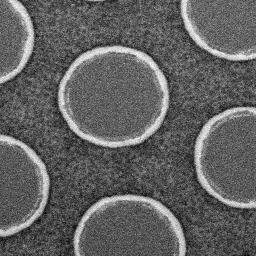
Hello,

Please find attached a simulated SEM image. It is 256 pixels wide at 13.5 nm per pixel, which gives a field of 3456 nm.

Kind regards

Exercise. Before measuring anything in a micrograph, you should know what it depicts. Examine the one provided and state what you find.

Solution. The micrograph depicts raised bodies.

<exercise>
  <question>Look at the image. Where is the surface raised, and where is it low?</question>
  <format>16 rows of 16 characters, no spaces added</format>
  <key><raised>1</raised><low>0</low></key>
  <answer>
1000000000011111
1100000000001111
1100000000001111
1100011110000011
1000111111000000
0000111111000000
0000111111000000
0000111111000111
0000011110000111
1100000000001111
1110000000001111
1110000000000111
1110000110000011
1100011111100000
1000011111100000
0000011111100000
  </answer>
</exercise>